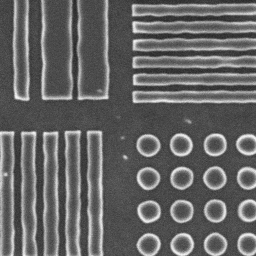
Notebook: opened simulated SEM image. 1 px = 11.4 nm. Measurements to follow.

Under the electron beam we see groups of lines, slits or small figures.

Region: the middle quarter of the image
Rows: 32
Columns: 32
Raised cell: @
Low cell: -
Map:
@@--@@@@@@@------@@@@@@@@@@@@@@@
@@--@@@@@@@---------------------
@@--@@@@@@@---------------------
@@--@@@@@@@------@@@@@@@@@@@@@@@
@@--@@@@@@@-------@@@@@@@@@@@@@@
@@--@@@@@@@---------------------
@@--@@@@@@@---------------------
@@--@@@@@@@------@@@@@@@@@@@@@@@
@@--@@@@@@@------@@@@@@@@@@@@@@@
-----------------@--------------
--------------------------------
--------------------------------
--------------------------------
--------------------------------
--------------------------------
--------------------------------
--------------------------------
-@@@--@@@-----------------------
-@@@--@@@----------@@@@----@@@@-
-@@@--@@@---------@@@@@@---@@@@@
-@@@--@@@---------@@@@@@---@@@@@
-@@@--@@@----------@@@@@---@@@@@
-@@@--@@@----------@@@@-----@@@-
-@@@--@@@-----------------------
-@@@--@@@-----------------------
-@@@--@@@-----------------------
-@@@--@@@-----------@@------@@@-
-@@@--@@@----------@@@@----@@@@@
-@@@--@@@---------@@@@@@---@@@@@
-@@@--@@@----------@@@@----@@@@@
-@@@---@@-----------@@@-----@@@-
-@@@--@@@-----------------------